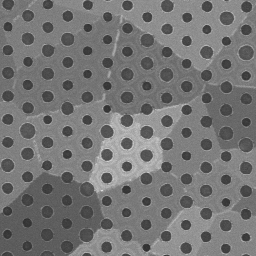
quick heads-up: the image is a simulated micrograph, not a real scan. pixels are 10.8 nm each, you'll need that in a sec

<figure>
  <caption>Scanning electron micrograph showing a regular array of holes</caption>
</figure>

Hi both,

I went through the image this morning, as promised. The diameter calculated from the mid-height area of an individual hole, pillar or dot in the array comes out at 11.3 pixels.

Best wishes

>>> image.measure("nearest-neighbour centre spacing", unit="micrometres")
0.246